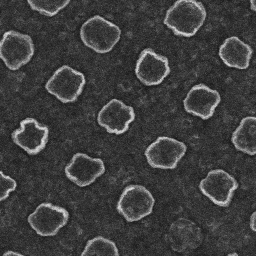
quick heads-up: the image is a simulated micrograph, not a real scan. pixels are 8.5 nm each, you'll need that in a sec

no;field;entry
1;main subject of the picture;a regular array of raised bodies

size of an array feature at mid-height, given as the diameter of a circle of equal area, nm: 277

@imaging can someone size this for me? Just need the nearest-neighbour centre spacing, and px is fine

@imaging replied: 59.8